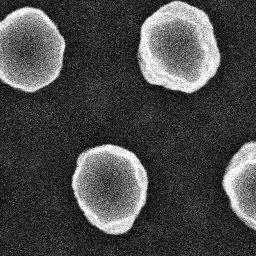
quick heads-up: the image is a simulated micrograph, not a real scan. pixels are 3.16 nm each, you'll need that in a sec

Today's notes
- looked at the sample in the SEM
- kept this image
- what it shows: raised bodies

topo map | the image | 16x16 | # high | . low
..........##....
###......####...
####.....####...
####.....#####..
####......###...
.##........#....
................
................
................
......##........
.....####......#
.....####.....##
.....####.....##
.....###.......#
................
................